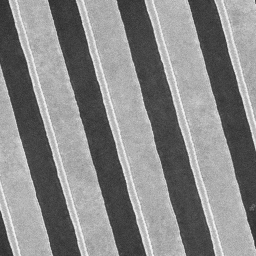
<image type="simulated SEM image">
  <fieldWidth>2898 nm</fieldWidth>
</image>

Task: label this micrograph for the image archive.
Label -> lines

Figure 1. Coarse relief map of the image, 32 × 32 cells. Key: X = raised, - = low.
-XXXXX----XXXXX---XXXXXX---XXXXX
--XXXX----XXXXX----XXXXX---XXXXX
--XXXXX---XXXXX----XXXXX----XXXX
--XXXXX---XXXXXX---XXXXX----XXXX
--XXXXX----XXXXX---XXXXXX---XXXX
---XXXX----XXXXX----XXXXX---XXXX
---XXXXX---XXXXX----XXXXX----XXX
---XXXXX----XXXX----XXXXX----XXX
----XXXX----XXXXX----XXXXX---XXX
----XXXXX---XXXXX----XXXXX---XXX
X---XXXXX---XXXXX----XXXXX----XX
X---XXXXX----XXXXX---XXXXX----XX
X----XXXX----XXXXX----XXXXX---XX
XX---XXXXX---XXXXX----XXXXX----X
XX---XXXXX---XXXXX----XXXXX----X
XX----XXXX----XXXXX---XXXXXX---X
XX----XXXXX---XXXXX----XXXXX---X
XXX---XXXXX---XXXXX----XXXXX----
XXX---XXXXX----XXXXX---XXXXX----
XXX----XXXX----XXXXX----XXXXX---
XXX----XXXXX---XXXXX----XXXXX---
XXXX---XXXXX---XXXXX----XXXXX---
XXXX----XXXX----XXXXX---XXXXX---
XXXX----XXXX----XXXXX----XXXXX--
XXXXX---XXXXX---XXXXX----XXXXX--
XXXXX---XXXXX---XXXXX----XXXXX--
XXXXX----XXXX----XXXXX----XXXXX-
XXXXX----XXXXX---XXXXX----XXXXX-
-XXXXX---XXXXX---XXXXX----XXXXX-
-XXXXX----XXXX----XXXXX---XXXXXX
-XXXXX----XXXX----XXXXX----XXXXX
--XXXX----XXXXX---XXXXX----XXXXX